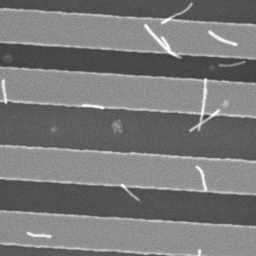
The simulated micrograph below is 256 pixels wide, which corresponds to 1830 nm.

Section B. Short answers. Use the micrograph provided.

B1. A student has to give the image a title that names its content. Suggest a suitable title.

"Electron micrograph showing lines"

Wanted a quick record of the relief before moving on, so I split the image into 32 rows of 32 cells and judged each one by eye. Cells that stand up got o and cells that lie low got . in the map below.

................................
oooooo..........................
ooooooooooooooooooooooo.........
oooooooooooooooooooooooooooooooo
oooooooooooooooooooooooooooooooo
..oooooooooooooooooooooooooooooo
...................ooooooooooooo
................................
oo..............................
ooooooooooooooooo...............
oooooooooooooooooooooooooooooooo
oooooooooooooooooooooooooooooooo
oooooooooooooooooooooooooooooooo
............oooooooooooooooooooo
............................oooo
................................
................................
................................
oooooo..........................
ooooooooooooooooooooo...........
oooooooooooooooooooooooooooooooo
oooooooooooooooooooooooooooooooo
..oooooooooooooooooooooooooooooo
.................ooooooooooooooo
................................
................................
ooo.............................
oooooooooooooooooo..............
oooooooooooooooooooooooooooooooo
oooooooooooooooooooooooooooooooo
oooooooooooooooooooooooooooooooo
...............ooooooooooooooooo